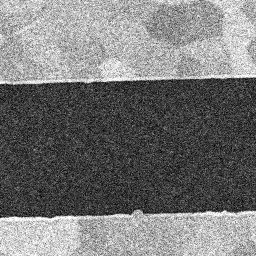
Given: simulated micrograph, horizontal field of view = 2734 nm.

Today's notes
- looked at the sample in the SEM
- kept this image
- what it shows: one or a few lines or trenches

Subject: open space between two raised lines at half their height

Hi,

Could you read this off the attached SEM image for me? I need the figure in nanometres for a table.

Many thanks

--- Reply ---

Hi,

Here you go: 1450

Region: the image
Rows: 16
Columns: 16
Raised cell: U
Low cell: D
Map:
UUUUUUUUUUUUUUUU
UUUUUUUUUUUUUUUU
UUUUUUUUUUUUUUUU
UUUUUUUUUUUUUUUU
UUUUUUUUUUUUUUUU
DDDDDDDDDDDDDDDD
DDDDDDDDDDDDDDDD
DDDDDDDDDDDDDDDD
DDDDDDDDDDDDDDDD
DDDDDDDDDDDDDDDD
DDDDDDDDDDDDDDDD
DDDDDDDDDDDDDDDD
DDDDDDDDDDDDDDDD
DDDDDDDUUUUUUUUU
UUUUUUUUUUUUUUUU
UUUUUUUUUUUUUUUU